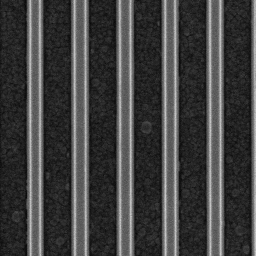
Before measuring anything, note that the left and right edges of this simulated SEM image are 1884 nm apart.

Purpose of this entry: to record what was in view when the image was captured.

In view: parallel lines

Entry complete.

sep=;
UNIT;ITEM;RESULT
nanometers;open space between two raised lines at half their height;234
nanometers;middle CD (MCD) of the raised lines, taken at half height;97.5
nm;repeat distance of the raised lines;331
